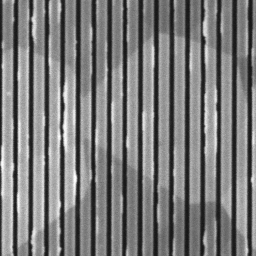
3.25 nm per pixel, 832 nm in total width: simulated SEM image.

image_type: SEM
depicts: parallel lines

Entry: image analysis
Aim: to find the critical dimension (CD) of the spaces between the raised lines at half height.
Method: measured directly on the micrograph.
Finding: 0.0171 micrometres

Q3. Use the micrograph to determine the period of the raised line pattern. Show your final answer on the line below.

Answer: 50.8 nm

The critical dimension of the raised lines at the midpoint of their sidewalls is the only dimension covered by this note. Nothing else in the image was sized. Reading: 34.5 nm